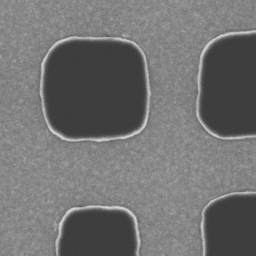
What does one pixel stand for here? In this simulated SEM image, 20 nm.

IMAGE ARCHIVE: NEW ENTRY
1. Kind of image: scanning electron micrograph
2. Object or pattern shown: raised bodies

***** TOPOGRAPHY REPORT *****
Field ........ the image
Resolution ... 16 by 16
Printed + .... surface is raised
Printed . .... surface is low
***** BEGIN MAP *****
................
................
....++++.....+++
...++++++....+++
...++++++...++++
...++++++...++++
...++++++...++++
...++++++...++++
....++++.....+++
................
................
................
.............+++
....++++.....+++
....+++++....+++
...++++++....+++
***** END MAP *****